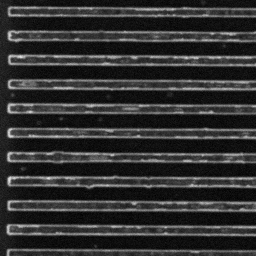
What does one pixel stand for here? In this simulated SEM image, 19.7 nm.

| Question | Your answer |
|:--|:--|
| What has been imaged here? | parallel lines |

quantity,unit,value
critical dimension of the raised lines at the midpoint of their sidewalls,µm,0.175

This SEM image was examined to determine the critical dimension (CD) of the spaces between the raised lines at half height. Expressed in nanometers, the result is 313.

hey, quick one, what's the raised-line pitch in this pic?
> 478 nm